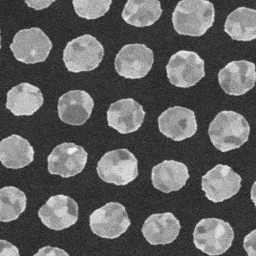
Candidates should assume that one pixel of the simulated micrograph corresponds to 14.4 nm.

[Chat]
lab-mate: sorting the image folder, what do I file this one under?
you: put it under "a regular array of raised bodies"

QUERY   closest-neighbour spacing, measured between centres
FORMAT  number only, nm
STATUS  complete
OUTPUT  742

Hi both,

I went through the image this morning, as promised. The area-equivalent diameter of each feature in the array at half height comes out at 0.521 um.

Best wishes